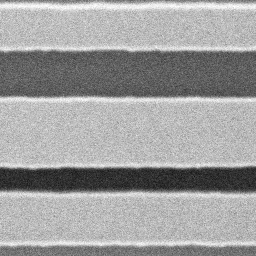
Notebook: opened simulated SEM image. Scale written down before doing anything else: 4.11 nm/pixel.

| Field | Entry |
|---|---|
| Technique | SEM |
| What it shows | lines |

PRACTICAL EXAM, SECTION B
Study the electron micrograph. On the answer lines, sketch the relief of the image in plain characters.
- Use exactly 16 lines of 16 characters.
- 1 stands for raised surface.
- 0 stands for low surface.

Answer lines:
1111111111111111
1111111111111111
1111111111111111
0000000000000000
0000000000000000
0000000000000000
1111111111111111
1111111111111111
1111111111111111
1111111111111111
0010000000000000
0000000000000000
1111111111111111
1111111111111111
1111111111111111
0000000000000000